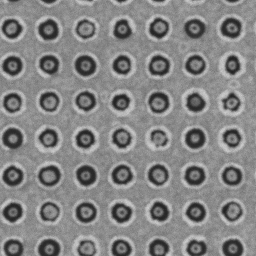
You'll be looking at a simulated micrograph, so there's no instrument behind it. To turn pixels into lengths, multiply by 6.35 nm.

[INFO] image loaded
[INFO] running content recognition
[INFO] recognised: a regular array of ring-shaped grooves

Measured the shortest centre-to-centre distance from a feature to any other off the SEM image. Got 227 nanometres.